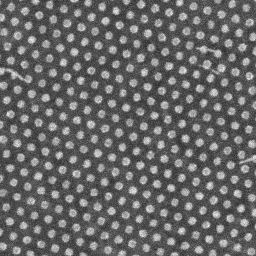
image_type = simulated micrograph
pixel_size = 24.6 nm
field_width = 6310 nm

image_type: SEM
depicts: a regular array of raised bodies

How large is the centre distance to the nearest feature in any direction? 0.357 µm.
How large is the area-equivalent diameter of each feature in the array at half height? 0.162 micrometres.